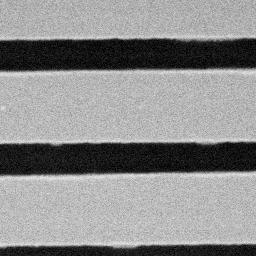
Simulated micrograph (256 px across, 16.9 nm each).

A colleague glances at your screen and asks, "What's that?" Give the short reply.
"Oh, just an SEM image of lines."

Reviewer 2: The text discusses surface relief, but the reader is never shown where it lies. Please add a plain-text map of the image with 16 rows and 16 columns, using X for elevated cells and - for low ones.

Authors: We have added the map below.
XXXXXXXXXXXXXXXX
XXXXXXXXXXXXXXXX
----------------
----------------
--XXXXXXXXXXXXXX
XXXXXXXXXXXXXXXX
XXXXXXXXXXXXXXXX
XXXXXXXXXXXXXXXX
XXXXXXXXXXXXXXXX
----------------
----------------
XXXXXXXXXXXXXXXX
XXXXXXXXXXXXXXXX
XXXXXXXXXXXXXXXX
XXXXXXXXXXXXXXXX
----------------